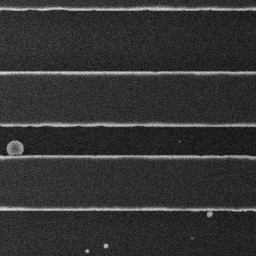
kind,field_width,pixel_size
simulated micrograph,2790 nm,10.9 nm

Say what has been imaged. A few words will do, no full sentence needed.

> lines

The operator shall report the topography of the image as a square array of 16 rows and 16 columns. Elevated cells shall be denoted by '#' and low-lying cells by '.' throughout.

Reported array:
################
................
................
................
................
################
################
################
................
#...............
################
################
################
................
................
................